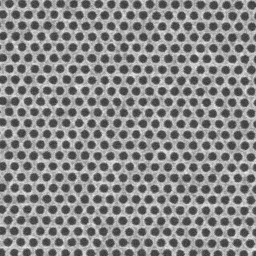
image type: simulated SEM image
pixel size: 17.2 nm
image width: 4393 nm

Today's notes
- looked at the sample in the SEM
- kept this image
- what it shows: a regular array of holes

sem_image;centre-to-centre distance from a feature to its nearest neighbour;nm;208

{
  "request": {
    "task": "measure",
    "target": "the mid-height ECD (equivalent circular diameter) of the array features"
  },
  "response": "170 nm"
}